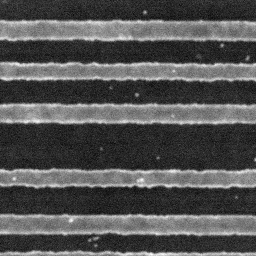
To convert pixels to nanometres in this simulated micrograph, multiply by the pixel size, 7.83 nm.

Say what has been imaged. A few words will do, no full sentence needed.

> lines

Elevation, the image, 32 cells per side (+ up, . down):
................................
................................
................................
++++++++++++++++++++++++++++++++
++++++++++++++++++++++++++++++++
................................
................................
................................
++++++++++++++++++++++++++++++++
++++++++++++++++++++++++++++++++
................................
................................
................................
++++++++++++++++++++++++++++++++
++++++++++++++++++++++++++++++++
................................
................................
................................
................................
................................
................................
++++++++++++++++++++++++++++++++
++++++++++++++++++++++++++++++++
................................
................................
................................
................................
++++++++++++++++++++++++++++++++
++++++++++++++++++++++++++++++++
................................
................................
....++..+++..+..................